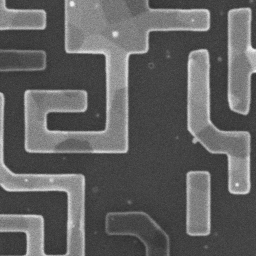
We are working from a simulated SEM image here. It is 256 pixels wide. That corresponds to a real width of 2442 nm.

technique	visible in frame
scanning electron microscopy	wiring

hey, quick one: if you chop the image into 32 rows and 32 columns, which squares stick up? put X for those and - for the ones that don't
X-------XXXXXXXXXXX-------------
XXXXXX--XXXXXXXXXXXXXXXXXX---XX-
XXXXXX--XXXXXXXXXXXXXXXXXX---XX-
XXXXX---XXXXXXXXXXXXXXXXXX---XX-
--------XXXXXXXXXX-----------XX-
--------XXXXXXXXXX-----------XX-
XXXXX---XXXXXXXXXX------XX---XXX
XXXXXX-------XXX--------XX---XXX
XXXXX--------XXX--------XX---XXX
-------------XXX--------XX---XX-
-------------XXX--------XX---XX-
---XXXXXXXX--XXX--------XX---XX-
---XXXXXXXX--XXX--------XX---XX-
---XXXXXXXX--XXX--------XX---XX-
---XXX-------XXX--------XX------
---XXX-------XXX--------XXX-----
---XXXXX----XXXX--------XXXX----
---XXXXXXXXXXXXX---------XXXXXX-
---XXXXXXXXXXXXX----------XXXXX-
----------------------------XXX-
X----------------------------XX-
XX----------------------XX---XX-
XXXXXXXXXX-------------XXX---XX-
XXXXXXXXXX-------------XXX---XX-
--------XX-------------XXX------
---------X-------------XXX------
---------X-------------XXX------
XXXXX---XX---XXXXXX----XXX------
XXXXX---XX---XXXXXXX---XXX------
---XX---XX-------XXXX-----------
---XX---XX--------XXX-----------
---XXX--XX--------XXX-----------